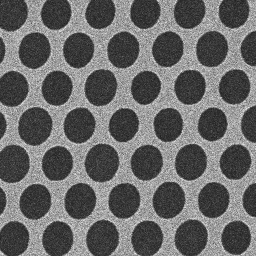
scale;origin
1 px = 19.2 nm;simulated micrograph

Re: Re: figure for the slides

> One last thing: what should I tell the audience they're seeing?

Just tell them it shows a regular array of holes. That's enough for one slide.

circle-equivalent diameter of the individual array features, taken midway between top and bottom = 661 nanometers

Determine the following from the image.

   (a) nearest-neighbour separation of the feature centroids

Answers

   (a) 0.839 µm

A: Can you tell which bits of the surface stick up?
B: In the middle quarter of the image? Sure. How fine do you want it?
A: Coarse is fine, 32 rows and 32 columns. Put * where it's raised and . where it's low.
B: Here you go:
*....*******.....*******...*****
********...********************.
.*****.......*****.....******...
..****.......****.......****....
..***........****.......****....
..***.........***.......***.....
..***........****.......***.....
..***........****.......****....
.****........****......*****....
.*****......******....*******...
********..**********************
**....*******....*******....****
*......*****......*****......***
........****......*****.......**
........***........***........**
........***........***........**
........***........***........**
.......*****......*****......***
*......*****.....*******....****
**....********.**********..*****
*******.....*******....*******..
.*****.......*****......*****...
..****.......****.......****....
..***.........***........***....
..***.........**.........***....
..***.........**.........***....
..***........****.......****....
.*****.......****.......****....
.*****......******.....******...
********..***************...****
**.....******.....******.....***
*......*****.......****.......**